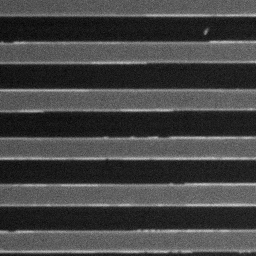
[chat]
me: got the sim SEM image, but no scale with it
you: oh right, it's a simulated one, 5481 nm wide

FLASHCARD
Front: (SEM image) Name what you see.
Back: lines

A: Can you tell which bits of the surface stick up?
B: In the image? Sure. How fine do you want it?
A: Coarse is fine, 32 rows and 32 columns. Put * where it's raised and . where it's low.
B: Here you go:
********************************
********************************
................................
................................
................................
********************************
********************************
********************************
................................
................................
................................
********************************
********************************
********************************
................................
................................
................................
********************************
********************************
********************************
................................
................................
................................
********************************
********************************
********************************
................................
................................
................................
********************************
********************************
................................